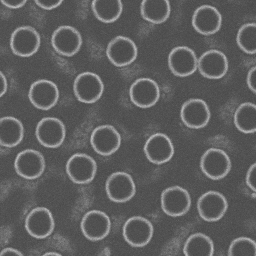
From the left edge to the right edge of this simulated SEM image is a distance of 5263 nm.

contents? a regular array of raised bodies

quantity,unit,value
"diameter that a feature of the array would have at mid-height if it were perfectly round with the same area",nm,581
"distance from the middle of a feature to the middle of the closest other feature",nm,865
